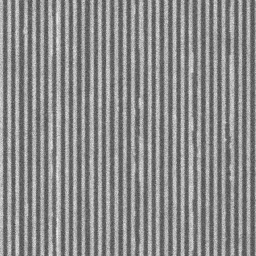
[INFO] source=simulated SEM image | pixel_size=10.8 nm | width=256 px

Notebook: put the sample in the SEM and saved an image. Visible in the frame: parallel lines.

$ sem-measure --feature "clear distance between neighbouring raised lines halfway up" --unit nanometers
52.8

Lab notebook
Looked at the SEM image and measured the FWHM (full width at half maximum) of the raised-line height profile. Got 35.2 nm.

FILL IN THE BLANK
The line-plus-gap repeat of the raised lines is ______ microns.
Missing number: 0.0893